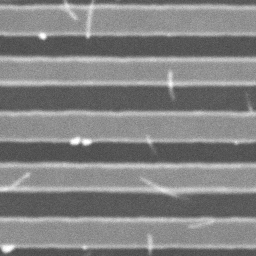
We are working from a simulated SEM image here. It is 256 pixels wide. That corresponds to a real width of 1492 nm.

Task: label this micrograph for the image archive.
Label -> lines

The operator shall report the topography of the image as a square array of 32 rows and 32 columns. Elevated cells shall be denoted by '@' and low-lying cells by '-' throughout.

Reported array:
--------------------------------
@@@@@@@@@@@@@@@@@@@@@@@@@@@@@@@@
@@@@@@@@@@@@@@@@@@@@@@@@@@@@@@@@
@@@@@@@@@@@@@@@@@@@@@@@@@@@@@@@@
-----@--------------------------
--------------------------------
--------------------------------
@@@@@@@@@@@@@@@@@@@@@@@@@@@@@@@@
@@@@@@@@@@@@@@@@@@@@@@@@@@@@@@@@
@@@@@@@@@@@@@@@@@@@@@@@@@@@@@@@@
---------------@-----@@@--@@@@@@
--------------------------------
--------------------------------
--------------------------------
@@@@@@@@@@@@@@@@@@@@@@@@@@@@@@@@
@@@@@@@@@@@@@@@@@@@@@@@@@@@@@@@@
@@@@@@@@@@@@@@@@@@@@@@@@@@@@@@@@
@@@@@@@@@@@@@@@@@@@@@@@@@@@@@@@@
--------------------------------
--------------------------------
-@---@@@@-----------------------
@@@@@@@@@@@@@@@@@@@@@@@@@@@@@@@@
@@@@@@@@@@@@@@@@@@@@@@@@@@@@@@@@
@@@@@@@@@@@@@@@@@@@@@@@@@@@@@@@@
--------------------------------
--------------------------------
--------------------------------
@@@@@@@@@-@@@@@@@@@@@@---@@--@@-
@@@@@@@@@@@@@@@@@@@@@@@@@@@@@@@@
@@@@@@@@@@@@@@@@@@@@@@@@@@@@@@@@
@@@@@@@@@@@@@@@@@@@@@@@@@@@@@@@@
--------------------------------